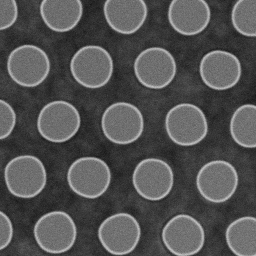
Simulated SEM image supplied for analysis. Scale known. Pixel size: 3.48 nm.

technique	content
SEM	an array of small figures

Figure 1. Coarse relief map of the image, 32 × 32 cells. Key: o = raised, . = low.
oo...ooooo...ooooo...ooooo....oo
oo...ooooo...ooooo...ooooo...ooo
oo...ooooo...ooooo...ooooo...ooo
o.....ooo.....ooo.....oooo...ooo
................................
................................
..ooo.....ooo.....ooo......o....
.ooooo...ooooo...ooooo...ooooo..
.ooooo...ooooo...ooooo...ooooo..
.ooooo...ooooo...ooooo...ooooo..
..ooo.....ooo.....ooo.....ooo...
................................
................................
o.....ooo.....ooo.....ooo.....oo
oo...ooooo...ooooo...oooo....ooo
oo...ooooo...ooooo...ooooo...ooo
o....oooo....ooooo...ooooo...ooo
......oo......ooo.....ooo....ooo
................................
...o............................
.oooo....oooo....oooo.....ooo...
.ooooo..oooooo...oooo....oooo...
.ooooo..oooooo...ooooo...ooooo..
.oooo....oooo....oooo....ooooo..
..oo......oo......ooo....oooo...
................................
................................
o....oooo....oooo....ooo......oo
o...ooooo...ooooo....oooo....ooo
o...ooooo...ooooo...ooooo...oooo
o....oooo....oooo....oooo....ooo
......oo......oo......ooo....ooo